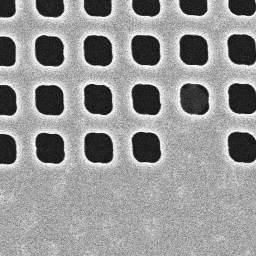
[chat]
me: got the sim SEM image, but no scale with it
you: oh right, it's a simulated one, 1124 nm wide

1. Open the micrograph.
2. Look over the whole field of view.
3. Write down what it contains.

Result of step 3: a regular array of holes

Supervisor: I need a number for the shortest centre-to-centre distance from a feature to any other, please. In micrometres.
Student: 0.21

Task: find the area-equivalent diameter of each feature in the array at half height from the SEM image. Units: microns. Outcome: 0.138